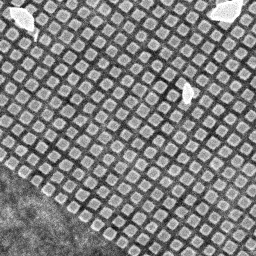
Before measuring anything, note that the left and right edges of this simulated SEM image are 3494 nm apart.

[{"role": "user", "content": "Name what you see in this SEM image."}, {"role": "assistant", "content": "a regular array of raised bodies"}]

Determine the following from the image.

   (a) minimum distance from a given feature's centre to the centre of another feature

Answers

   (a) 0.202 micrometres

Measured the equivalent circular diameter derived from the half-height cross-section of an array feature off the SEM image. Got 145 nm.